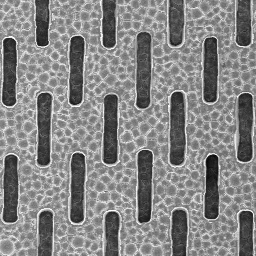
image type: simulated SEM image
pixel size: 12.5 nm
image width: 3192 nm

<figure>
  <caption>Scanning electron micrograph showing a regular array of holes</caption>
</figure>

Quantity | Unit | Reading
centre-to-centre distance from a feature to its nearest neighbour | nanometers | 827